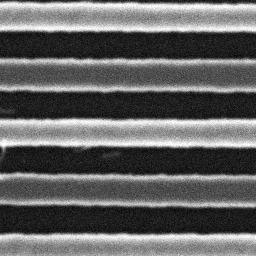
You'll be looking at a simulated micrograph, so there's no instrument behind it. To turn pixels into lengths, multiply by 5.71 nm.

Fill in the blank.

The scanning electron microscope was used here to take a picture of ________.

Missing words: lines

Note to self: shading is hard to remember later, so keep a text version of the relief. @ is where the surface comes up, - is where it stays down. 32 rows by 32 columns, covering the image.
@@@@@@@@@@@@@@@@@@------@-------
@@@@@@@@@@@@@@@@@@@@@@@@@@@@@@@@
@@@@@@@@@@@@@@@@@@@@@@@@@@@@@@@@
@@@@@@@@@@@@@@@@@@@@@@@@@@@@@@@@
--------------------------------
--------------------------------
--------------------------------
@@@@@@@@@@@@-@@@--@@@---@-----@-
@@@@@@@@@@@@@@@@@@@@@@@@@@@@@@@@
@@@@@@@@@@@@@@@@@@@@@@@@@@@@@@@@
@@@@@@@@@@@@@@@@@@@@@@@@@@@@@@@@
--------------------------------
--------------------------------
--------------------------------
--------------------------------
@@@@@@@@@@@@@@@@@@@@@@@@@@@@@@@@
@@@@@@@@@@@@@@@@@@@@@@@@@@@@@@@@
@@@@@@@@@@@@@@@@@@@@@@@@@@@@@@@@
--------------------------------
--------------------------------
--------------------------------
--------------------------------
@@@@@@@@@@@@@@@@@@@@@@@@@@@@@@@@
@@@@@@@@@@@@@@@@@@@@@@@@@@@@@@@@
@@@@@@@@@@@@@@@@@@@@@@@@@@@@@@@@
-@@@@@@@@@@@@@@@@@@@@@@@@@@@@@@@
--------------------------------
--------------------------------
--------------------------------
@@@@@@@@@@@@@@@@@@@@@@@@@@@@@@@@
@@@@@@@@@@@@@@@@@@@@@@@@@@@@@@@@
@@@@@@@@@@@@@@@@@@@@@@@@@@@@@@@@